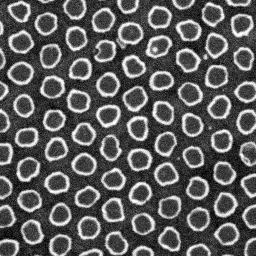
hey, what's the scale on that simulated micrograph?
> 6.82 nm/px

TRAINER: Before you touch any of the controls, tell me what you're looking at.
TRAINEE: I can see a regular array of raised bodies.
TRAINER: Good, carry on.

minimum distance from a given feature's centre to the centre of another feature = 208 nm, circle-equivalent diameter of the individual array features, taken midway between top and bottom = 0.143 µm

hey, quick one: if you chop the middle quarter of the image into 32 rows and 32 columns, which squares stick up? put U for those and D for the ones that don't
DDUUUUUDDDDDDDDUUUUUDDDDDDDDDUUU
DDUUUUUDDDDDDDDUUUUUDDDDDDDDDDUU
DDUUUUDDDDDUDDDDUUUDDDDUUUDDDDDD
DDDDUUDDDUUUUDDDDDDDDDUUUUUDDDDD
DDDDDDDDDUUUUUDDDDDDDDUUUUUDDDDD
DDDDDDDDUUUUUUDDDDDDDDUUUUUDDDUU
DDDDDDDDDUUUUDDDDUUUDDDDDDDDDUUU
DUUUUUDDDDUUUDDUUUUUDDDDDDDDDUUU
DUUUUUDDDDDDDDDUUUUUUDDDDDDDDUUU
DUUUUUDDDDDDDDDUUUUUDDDDDDDDDDUU
DUUUUUDDDDDDDDDDUUUDDDDUUUUDDDDD
DDUUUDDDDUUUUUDDDUDDDDDUUUUDDDDD
DDDDDDDDUUUUUUDDDDDDDDUUUUUDDDDD
DDDDDDDDDUUUUDDDDDUUDDDUUUUDDDUU
DDDDDDDDDUUUUDDDDUUUUDDDUUUDDDUU
DDDDUUDDDDUDDDDDUUUUUDDDDDDDDDUU
DDDUUUUDDDDDDDDDUUUUUDDDDDDDDDUU
DDUUUUUUDDDDDDDDDUUUUDDDDUUDDDDU
DDUUUUUDDDUUUDDDDDUUDDDDUUUUDDDD
DDDUUUUDDDUUUDDDDDDDDDDUUUUUDDDD
DDDDDDDDDDUUUDDDDDDDDDDUUUUUDDDD
UDDDDDDDDUUUUUDDDDUUDDDUUUUDDDUU
UDDDUUDDDDUUUUDDUUUUUDDDUUDDDDUU
DDDUUUUDDDDUUDDDUUUUUUDDDDDDDDUU
DDDUUUUUDDDDDDDDUUUUUUDDDDDDDDDU
DDUUUUUUDDDDDDDDDUUUUDDDUUUDDDDD
DDDUUUUUDDDDUUDDDDUDDDDUUUUUDDDD
DDDDDUUDDDUUUUDDDDDDDDDUUUUUDDDD
UDDDDDDDDDUUUUUDDDDDDDDUUUUUDDDD
UDDDDDDDDDUUUUUDDDDDDDDDUUUDDDDD
UDDDDDDDDDUUUUUDDDUUUDDDDDDDDDDU
UDDDDUUUDDDDDDDDDUUUUUDDDDDDDDDU